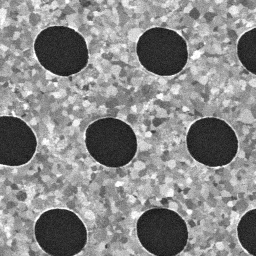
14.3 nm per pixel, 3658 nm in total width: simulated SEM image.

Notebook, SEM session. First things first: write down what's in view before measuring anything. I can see holes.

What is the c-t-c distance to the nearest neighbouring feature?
1440 nm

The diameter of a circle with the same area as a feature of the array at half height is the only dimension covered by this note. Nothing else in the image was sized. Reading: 739 nm